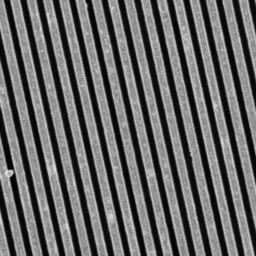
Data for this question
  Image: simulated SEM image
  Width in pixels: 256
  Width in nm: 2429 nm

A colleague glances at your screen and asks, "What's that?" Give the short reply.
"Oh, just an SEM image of parallel lines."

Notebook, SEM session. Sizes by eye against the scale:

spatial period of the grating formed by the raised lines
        151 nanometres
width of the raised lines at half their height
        85.8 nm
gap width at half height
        6.36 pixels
